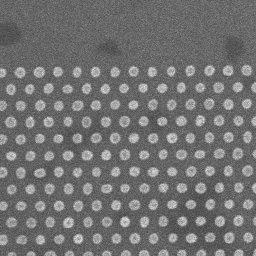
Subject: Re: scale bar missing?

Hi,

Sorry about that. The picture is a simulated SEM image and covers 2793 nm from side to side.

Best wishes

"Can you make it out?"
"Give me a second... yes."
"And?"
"a regular array of raised bodies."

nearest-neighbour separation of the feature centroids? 203 nanometres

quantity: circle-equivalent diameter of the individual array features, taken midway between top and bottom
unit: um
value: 0.104